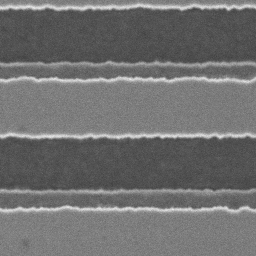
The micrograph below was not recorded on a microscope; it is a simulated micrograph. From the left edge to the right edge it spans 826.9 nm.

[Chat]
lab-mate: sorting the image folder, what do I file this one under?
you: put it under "lines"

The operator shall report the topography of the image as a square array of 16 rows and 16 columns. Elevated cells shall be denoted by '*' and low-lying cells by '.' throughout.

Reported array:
********..**..*.
................
................
................
.***********....
****************
****************
****************
****************
................
................
................
..***..*********
****************
****************
****************